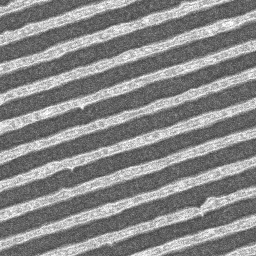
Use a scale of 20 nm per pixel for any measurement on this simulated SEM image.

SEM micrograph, parallel lines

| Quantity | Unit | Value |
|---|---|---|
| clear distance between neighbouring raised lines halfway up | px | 17.4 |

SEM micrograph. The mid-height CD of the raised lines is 200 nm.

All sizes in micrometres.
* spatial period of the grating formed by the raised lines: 0.555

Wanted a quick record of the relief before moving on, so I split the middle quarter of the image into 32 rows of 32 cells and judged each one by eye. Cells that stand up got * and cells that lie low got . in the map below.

......*******...............****
..********..............********
*******..............*********..
****..............*********.....
*..............*******..........
.............*******............
.........********..............*
.......********..............***
....*******...............******
********..............********..
*****................******.....
*................*******........
..............*******...........
..........*******...............
.......********..............***
...*********...............*****
********...............*********
******...............********...
***...............********......
..............*********.........
............********............
........********..............**
....*********..............*****
..*******................*******
*******..............********...
****.............*********......
..............**********........
............*********...........
........*********.............**
.....*********..............****
...********..............*******
********...............*******..